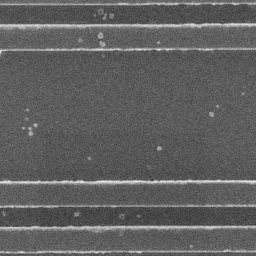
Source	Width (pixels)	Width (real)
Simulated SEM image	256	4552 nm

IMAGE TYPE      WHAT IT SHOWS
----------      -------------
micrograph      lines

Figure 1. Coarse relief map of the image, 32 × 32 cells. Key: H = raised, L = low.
HHHHHHHHHHHHHHHHHHHHHHHHHLHHLHLH
LLLLLLLLLLLLLLLLLLLLLLLLLLLLLLLL
LLLLLLLLLLLLLLLLLLLLLLLLLLLLLLLL
HHHHHHHHHHHHHHHHHHHHHHHHHHHHHHHH
HHHHHHHHHHHHHHHHHHHHHHHHHHHHHHHH
HHHHHHHHHHHHHHHHHHHHHHHHHHHHHHHH
LLLLLLLLLLLLLLLLLLLLLLLLLLLLLLLL
LLLLLLLLLLLLLLLLLLLLLLLLLLLLLLLL
LLLLLLLLLLLLLLLLLLLLLLLLLLLLLLLL
LLLLLLLLLLLLLLLLLLLLLLLLLLLLLLLL
LLLLLLLLLLLLLLLLLLLLLLLLLLLLLLLL
LLLLLLLLLLLLLLLLLLLLLLLLLLLLLLLL
LLLLLLLLLLLLLLLLLLLLLLLLLLLLLLLL
LLLLLLLLLLLLLLLLLLLLLLLLLLLLLLLL
LLLLLLLLLLLLLLLLLLLLLLLLLLLLLLLL
LLLLLLLLLLLLLLLLLLLLLLLLLLLLLLLL
LLLLLLLLLLLLLLLLLLLLLLLLLLLLLLLL
LLLLLLLLLLLLLLLLLLLLLLLLLLLLLLLL
LLLLLLLLLLLLLLLLLLLLLLLLLLLLLLLL
LLLLLLLLLLLLLLLLLLLLLLLLLLLLLLLL
LLLLLLLLLLLLLLLLLLLLLLLLLLLLLLLL
LLLLLLLLLLLLLLLLLLLLLLLLLLLLLLLL
LLLLLLLLLLLLLLLLLLLLLLLLLLLLLLLL
HHHHHHHHHHHHHHHHHHHHHHHHHHHHHHHH
HHHHHHHHHHHHHHHHHHHHHHHHHHHHHHHH
HHHHHHHHHHHHHHHHHHHHHHHHHHHHHHHH
LLLLLLLLLLLLLLLLLLLLLLLLLLLLLLLL
LLLLLLLLLLLLLLLLLLLLLLLLLLLLLLLL
HHHHHHHHHHHHHHHHHHHHHHHHHHHHHHHH
HHHHHHHHHHHHHHHHHHHHHHHHHHHHHHHH
HHHHHHHHHHHHHHHHHHHHHHHHHHHHHHHH
HHHHHHHHHHHHHHLLHHLLLLLLLLLLLLLL